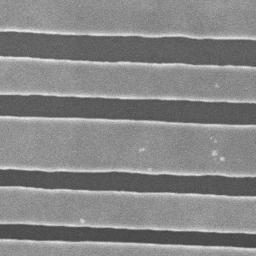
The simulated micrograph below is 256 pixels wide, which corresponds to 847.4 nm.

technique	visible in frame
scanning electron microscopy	lines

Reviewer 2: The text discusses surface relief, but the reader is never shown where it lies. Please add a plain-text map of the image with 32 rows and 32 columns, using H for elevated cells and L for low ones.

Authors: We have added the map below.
HHHHHHHHHHHHHHHHHHHHHHHHHHHHHHHH
HHHHHHHHHHHHHHHHHHHHHHHHHHHHHHHH
HHHHHHHHHHHHHHHHHHHHHHHHHHHHHHHH
HHHHHHHHHHHHHHHHHHHHHHHHHHHHHHHH
LLLLLLLLLLLLLLLLLHHHHHHHHHHHHHHH
LLLLLLLLLLLLLLLLLLLLLLLLLLLLLLLL
LLLLLLLLLLLLLLLLLLLLLLLLLLLLLLLL
HHHHHHHLLLLLLLLLLLLLLLLLLLLLLLLL
HHHHHHHHHHHHHHHHHHHHHHHHHHHHHHHH
HHHHHHHHHHHHHHHHHHHHHHHHHHHHHHHH
HHHHHHHHHHHHHHHHHHHHHHHHHHHHHHHH
HHHHHHHHHHHHHHHHHHHHHHHHHHHHHHHH
LLLLLLLLLLLLLLLLLLLLLLLHHHHHHHHH
LLLLLLLLLLLLLLLLLLLLLLLLLLLLLLLL
LLLLLLLLLLLLLLLLLLLLLLLLLLLLLLLL
HHHHHHHHHHHHHHHHHHHHHHHHHLLLLLLL
HHHHHHHHHHHHHHHHHHHHHHHHHHHHHHHH
HHHHHHHHHHHHHHHHHHHHHHHHHHHHHHHH
HHHHHHHHHHHHHHHHHHHHHHHHHHHHHHHH
HHHHHHHHHHHHHHHHHHHHHHHHHHHHHHHH
HHHHHHHHHHHHHHHHHHHHHHHHHHHHHHHH
LLLLLLLLLLLLLLLLHHHHHHHHHHHHHHHH
LLLLLLLLLLLLLLLLLLLLLLLLLLLLLLLL
HHHHHLLLLLLLLLLLLLLLLLLLLLLLLLLL
HHHHHHHHHHHHHHHHHHHHHHHHHHHHHLLL
HHHHHHHHHHHHHHHHHHHHHHHHHHHHHHHH
HHHHHHHHHHHHHHHHHHHHHHHHHHHHHHHH
HHHHHHHHHHHHHHHHHHHHHHHHHHHHHHHH
LLLLLLLLLLLLLLLHHHHHHHHHHHHHHHHH
LLLLLLLLLLLLLLLLLLLLLLLLLLLLLLLL
HHHHHHHHHHHHHHHHHHLLLLLLLLLLLLLL
HHHHHHHHHHHHHHHHHHHHHHHHHHHHHHHH